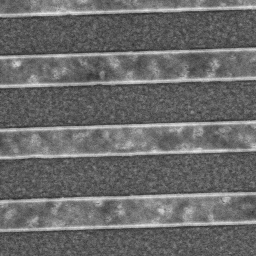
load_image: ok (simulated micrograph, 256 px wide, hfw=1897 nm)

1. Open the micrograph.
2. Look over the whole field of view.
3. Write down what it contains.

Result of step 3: one or a few lines or trenches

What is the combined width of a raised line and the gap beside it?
0.534 microns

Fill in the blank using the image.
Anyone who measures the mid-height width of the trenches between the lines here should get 315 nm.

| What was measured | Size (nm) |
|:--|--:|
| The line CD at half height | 224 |